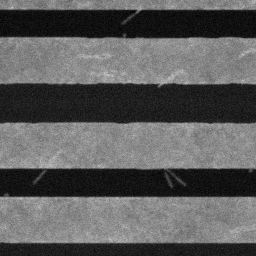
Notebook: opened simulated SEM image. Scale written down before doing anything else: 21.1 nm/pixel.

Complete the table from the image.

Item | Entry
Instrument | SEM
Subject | lines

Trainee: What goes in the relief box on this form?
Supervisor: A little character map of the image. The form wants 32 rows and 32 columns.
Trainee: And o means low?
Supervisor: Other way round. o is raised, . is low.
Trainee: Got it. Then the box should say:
oooooooooooooooooooooooooooooooo
................................
................................
................................
................................
oooooooooooooooooooooooooooooooo
oooooooooooooooooooooooooooooooo
oooooooooooooooooooooooooooooooo
oooooooooooooooooooooooooooooooo
oooooooooooooooooooooooooooooooo
...................oo...........
................................
................................
................................
................................
ooooooooooooooo.oooooooooo..o..o
oooooooooooooooooooooooooooooooo
oooooooooooooooooooooooooooooooo
oooooooooooooooooooooooooooooooo
oooooooooooooooooooooooooooooooo
oooooooooooooooooooooooooooooooo
................................
................................
................................
................................
oooooooooooooooooooooooooooooooo
oooooooooooooooooooooooooooooooo
oooooooooooooooooooooooooooooooo
oooooooooooooooooooooooooooooooo
oooooooooooooooooooooooooooooooo
................................
................................